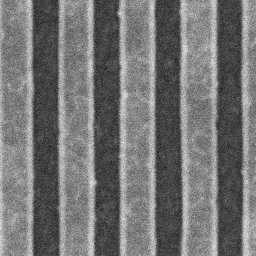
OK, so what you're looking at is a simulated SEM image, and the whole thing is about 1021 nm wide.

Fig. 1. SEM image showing one or a few lines or trenches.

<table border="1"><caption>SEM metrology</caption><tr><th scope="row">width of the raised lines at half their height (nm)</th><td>121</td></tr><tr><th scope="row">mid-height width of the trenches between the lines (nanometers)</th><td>121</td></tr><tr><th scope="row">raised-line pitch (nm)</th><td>245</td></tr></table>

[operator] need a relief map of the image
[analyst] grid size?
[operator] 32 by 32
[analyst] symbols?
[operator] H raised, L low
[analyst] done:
HHHHLLLLHHHLLLLHHHHLLLLHHHHLLLLH
HHHHLLLLHHHLLLLHHHHLLLLHHHHLLLLH
HHHHLLLLHHHLLLLHHHHLLLLHHHHLLLLH
HHHHLLLLHHHLLLLHHHHLLLLHHHHLLLLH
HHHHLLLLHHHLLLLHHHHLLLLHHHHLLLLH
HHHHLLLLHHHLLLLHHHHLLLLHHHHLLLLH
HHHHLLLLHHHLLLLHHHHLLLLHHHHLLLLH
HHHHLLLLHHHLLLLHHHHLLLLHHHHLLLLH
HHHHLLLLHHHLLLLHHHHLLLLHHHHLLLLH
HHHHLLLLHHHLLLLHHHHLLLLHHHHLLLLH
HHHHLLLLHHHLLLLHHHHLLLLHHHHLLLLH
HHHHLLLLHHHLLLLHHHHLLLLHHHHLLLLH
HHHHLLLLHHHLLLLHHHHLLLLHHHHLLLLH
HHHHLLLLHHHLLLLHHHHLLLLHHHHLLLLH
HHHHLLLLHHHLLLLHHHHLLLLHHHHLLLLH
HHHHLLLLHHHLLLLHHHHLLLLHHHHLLLLH
HHHHLLLLHHHLLLLHHHHLLLLHHHHLLLLH
HHHHLLLLHHHLLLLHHHHLLLLHHHHLLLLH
HHHHLLLLHHHLLLLHHHHLLLLHHHHLLLLH
HHHHLLLLHHHLLLLHHHHLLLLHHHHLLLLH
HHHHLLLLHHHLLLLHHHHLLLLHHHHLLLLH
HHHHLLLLHHHLLLLHHHHLLLLHHHHLLLLH
HHHHLLLLHHHHLLLHHHHLLLLHHHHLLLLH
HHHHLLLLHHHHLLLHHHHLLLLHHHHLLLLH
HHHHLLLLHHHLLLLHHHHLLLLHHHHLLLLH
HHHHLLLLHHHLLLLHHHHLLLLHHHHLLLLH
HHHHLLLLHHHHLLLHHHHLLLLHHHHLLLLH
HHHHLLLLHHHHLLLHHHHLLLLHHHHLLLLH
HHHHLLLLHHHLLLLHHHHLLLLHHHHLLLLH
HHHHLLLLHHHLLLLHHHHLLLLHHHHLLLLH
HHHHLLLLHHHLLLLHHHHLLLLHHHHLLLLH
HHHHLLLLHHHLLLLHHHHLLLLHHHHLLLLH